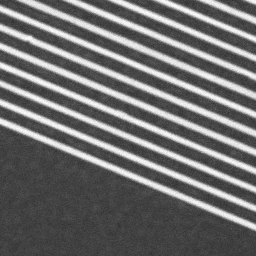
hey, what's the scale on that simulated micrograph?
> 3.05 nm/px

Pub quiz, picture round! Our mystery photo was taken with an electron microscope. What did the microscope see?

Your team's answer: parallel lines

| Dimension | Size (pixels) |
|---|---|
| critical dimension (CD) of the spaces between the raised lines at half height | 12.3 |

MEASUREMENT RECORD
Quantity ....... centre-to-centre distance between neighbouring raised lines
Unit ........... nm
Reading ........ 52.9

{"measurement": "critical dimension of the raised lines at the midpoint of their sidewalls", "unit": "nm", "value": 13.4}